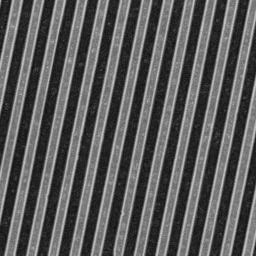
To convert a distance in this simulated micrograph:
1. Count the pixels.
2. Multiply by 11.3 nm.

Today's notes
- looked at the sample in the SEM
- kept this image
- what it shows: parallel lines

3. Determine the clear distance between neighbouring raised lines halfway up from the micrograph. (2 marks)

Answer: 141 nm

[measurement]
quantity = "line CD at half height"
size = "96.6 nanometres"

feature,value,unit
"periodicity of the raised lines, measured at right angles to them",238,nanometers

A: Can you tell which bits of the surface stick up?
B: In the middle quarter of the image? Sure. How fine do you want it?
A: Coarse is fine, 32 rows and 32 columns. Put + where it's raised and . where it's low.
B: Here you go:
++....++...++....++...++...++...
++...++....++...++...+++...++...
++...++....++...++...+++...++...
++...++...+++...++...++....++...
+....++...++....++...++...+++...
+....++...++....++...++...++....
+...++....++...++...+++...++...+
+...++....++...++...+++...++...+
+...++...++....++...++....++...+
....++...++....++...++...+++...+
....++...++....++...++...++....+
...++....++...++...+++...++...++
...++....++...++...+++...++...++
...++...++....++...++....++...++
...++...++....++...++...+++...++
...++...++....++...++...++...+++
..++....++...++...+++...++...+++
..++....++...++...+++...++...++.
..++...++....++...++....++...++.
..++...++....++...++...+++...++.
..++...++...+++...++...++....++.
.++....++...++...+++...++...+++.
.++....++...++...+++...++...++..
.++...++....++...++...+++...++..
.++...++....++...++...+++...++..
.++...++...++....++...++....++..
.+....++...++....++...++...+++..
++....++...++....++...++...++...
++...++....++...++...+++...++...
++...++....++...++...+++...++...
++...++...++....++...++....++...
+....++...++....++...++...+++...